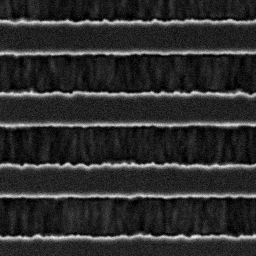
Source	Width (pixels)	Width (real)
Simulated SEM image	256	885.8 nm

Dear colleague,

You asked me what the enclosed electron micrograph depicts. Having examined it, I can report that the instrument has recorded lines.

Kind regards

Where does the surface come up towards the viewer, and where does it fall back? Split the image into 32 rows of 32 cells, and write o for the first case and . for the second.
................................
................................
............................o...
oooooooooooooooooooooooooooooooo
oooooooooooooooooooooooooooooooo
oooooooooooooooooooooooooooooooo
oooooooooooooooooooooooooooooooo
................................
................................
................................
................................
.........o..............o.......
oooooooooooooooooooooooooooooooo
oooooooooooooooooooooooooooooooo
oooooooooooooooooooooooooooooooo
oooooooooooooooooooooooooooooooo
................................
................................
................................
................................
.............o..................
oooooooooooooooooooooooooooooooo
oooooooooooooooooooooooooooooooo
oooooooooooooooooooooooooooooooo
oooooooooooooooooooooooooooooooo
................................
................................
................................
................................
....o....o.....o.oo...o.o.oo..oo
oooooooooooooooooooooooooooooooo
oooooooooooooooooooooooooooooooo